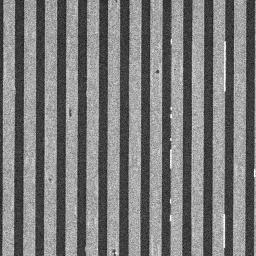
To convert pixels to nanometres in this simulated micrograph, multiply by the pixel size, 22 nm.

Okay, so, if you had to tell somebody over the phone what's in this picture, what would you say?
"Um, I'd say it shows parallel lines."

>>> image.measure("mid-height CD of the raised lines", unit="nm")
253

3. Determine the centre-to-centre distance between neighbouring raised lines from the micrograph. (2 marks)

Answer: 463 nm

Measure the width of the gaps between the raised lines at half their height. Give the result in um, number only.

0.217